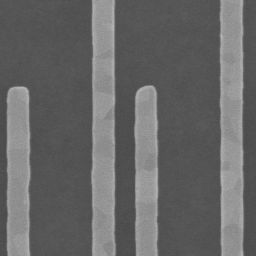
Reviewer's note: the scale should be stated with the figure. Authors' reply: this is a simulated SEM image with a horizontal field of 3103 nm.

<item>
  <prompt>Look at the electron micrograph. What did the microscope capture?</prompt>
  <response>wiring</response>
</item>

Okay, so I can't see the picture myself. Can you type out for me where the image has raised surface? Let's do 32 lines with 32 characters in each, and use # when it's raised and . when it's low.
............##..............##..
............##..............##..
............##..............##..
............##..............##..
............##..............##..
............##..............##..
............##..............##..
............##..............##..
............##..............##..
............##..............##..
............##..............##..
.##.........##...###........##..
.###........##...###........##..
.###........##...###........##..
.###........##...###........##..
.###........##...###........##..
.###........##...###........##..
.###........##...###........##..
.###........##...###........##..
.###........##...###........##..
.###........##...###........##..
.###.......###...###........##..
.###.......###...###........##..
.###........##...###........##..
.###........##...###........##..
.###........##...###........##..
.###........##...###........##..
.###........##...###........##..
.###........##...###........##..
.###........##...###........##..
.###........##...###........##..
.###........##...###........##..